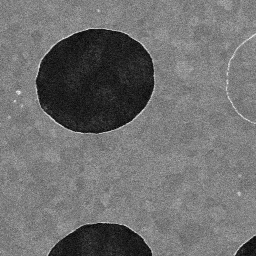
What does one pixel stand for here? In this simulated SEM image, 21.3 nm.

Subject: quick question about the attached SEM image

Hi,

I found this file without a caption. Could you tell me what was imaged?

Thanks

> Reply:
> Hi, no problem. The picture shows holes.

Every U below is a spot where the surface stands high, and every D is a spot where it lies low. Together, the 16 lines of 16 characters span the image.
UUUUUUUUUUUUUUUU
UUUUUUUUUUUUUUUU
UUUUDDDDUUUUUUUU
UUUDDDDDDUUUUUUU
UUDDDDDDDDUUUUUU
UUDDDDDDDDUUUUUU
UUUDDDDDDUUUUUUU
UUUDDDDDUUUUUUUU
UUUUUUUUUUUUUUUU
UUUUUUUUUUUUUUUU
UUUUUUUUUUUUUUUU
UUUUUUUUUUUUUUUU
UUUUUUUUUUUUUUUU
UUUUUUUUUUUUUUUU
UUUUUDDDUUUUUUUU
UUUDDDDDDUUUUUUD